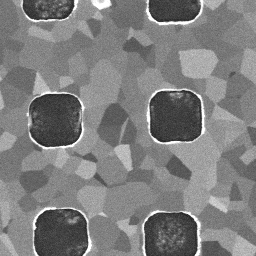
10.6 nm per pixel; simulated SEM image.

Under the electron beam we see holes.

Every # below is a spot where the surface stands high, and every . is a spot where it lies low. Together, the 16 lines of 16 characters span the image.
#....####....###
################
################
################
################
################
##...####....###
##...####....###
##...#####..####
################
################
################
################
##...####...####
##...####...####
##...####...####